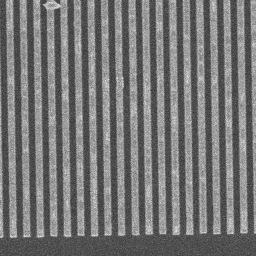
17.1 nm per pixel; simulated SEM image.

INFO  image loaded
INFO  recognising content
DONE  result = parallel lines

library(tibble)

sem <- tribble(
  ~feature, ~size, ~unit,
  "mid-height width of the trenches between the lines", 7.75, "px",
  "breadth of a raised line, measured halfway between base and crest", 100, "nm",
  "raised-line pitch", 232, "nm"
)